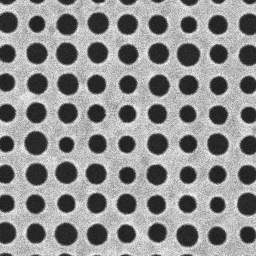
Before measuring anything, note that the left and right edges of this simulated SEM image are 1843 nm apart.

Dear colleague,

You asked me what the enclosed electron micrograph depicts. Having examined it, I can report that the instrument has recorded a regular array of holes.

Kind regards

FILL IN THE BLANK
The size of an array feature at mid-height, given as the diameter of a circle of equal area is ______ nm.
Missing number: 144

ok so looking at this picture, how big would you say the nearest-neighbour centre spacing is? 211 nm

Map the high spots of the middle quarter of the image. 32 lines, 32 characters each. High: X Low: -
XXXXXXXXXXXXXXXXXXXXXXXXXXXXXX--
XXXXXXXXXXXXXXXXXXXXXXXXXXXXXXXX
--XXXXXXXXXXXXXXXXXXXXXXXXXXXXXX
---XXX----XXXX----XXXX----XXX---
----XX----XXXX----XXX-----XXX---
----XX-----XXX----XXX-----XXX---
---XXX----XXXX----XXX-----XXX---
--XXXXX--XXXXXXXXXXXXX---XXXXX--
XXXXXXXXXXXXXXXXXXXXXXXXXXXXXXXX
XXXXXXXXXXXXXXXXXXXXXXXXXXXXXXXX
---XXXX--XXXXXX--XXXXX---XXXXX--
---XXX----XXXX----XXX-----XXX---
----XX-----XXX----XXX-----XXX---
---XXX----XXXX----XXX-----XXX---
--XXXXX--XXXXXX--XXXXX---XXXXX--
XXXXXXXXXXXXXXXXXXXXXXXXXXXXXXXX
XXXXXXXXXXXXXXXXXXXXXXXXXXXXXXXX
XXXXXXXX-XXXXXXXXXXXXXX-XXXXXXXX
--XXXXX---XXXX---XXXX-----XXX---
--XXXX-----XXX----XXX-----XXX---
---XXX-----XXX----XXX-----XXX---
--XXXXX---XXXX---XXXX-----XXX---
XXXXXXXX-XXXXXXXXXXXXX---XXXXXXX
XXXXXXXXXXXXXXXXXXXXXXXXXXXXXXXX
-XXXXXXXXXXXXXXXXXXXXXXXXXXXXXXX
---XXX----XXXXXXXXXXXX---XXXXXXX
---XX------XXX---XXXX----XXXX---
---XX------XXX----XXX-----XXX---
---XXX-----XXX----XXX-----XXX---
--XXXX----XXXX---XXXX----XXXXX--
XXXXXXXXXXXXXXXXXXXXXXXXXXXXXXXX
XXXXXXXXXXXXXXXXXXXXXXXXXXXXXXXX